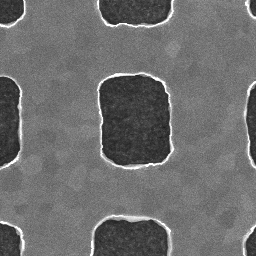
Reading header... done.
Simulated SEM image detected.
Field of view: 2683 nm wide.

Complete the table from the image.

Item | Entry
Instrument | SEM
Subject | holes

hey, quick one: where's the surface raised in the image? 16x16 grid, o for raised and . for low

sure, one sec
.ooooo.....ooooo
.ooooooo..oooooo
oooooooooooooooo
oooooooooooooooo
oooooooooooooooo
.ooooo....oooooo
.ooooo.....oooo.
.ooooo.....oooo.
.ooooo.....ooooo
.ooooo.....ooooo
oooooooooooooooo
oooooooooooooooo
oooooooooooooooo
oooooooooooooooo
.ooooo....oooooo
.ooooo.....oooo.